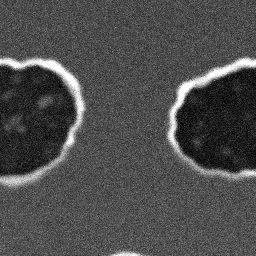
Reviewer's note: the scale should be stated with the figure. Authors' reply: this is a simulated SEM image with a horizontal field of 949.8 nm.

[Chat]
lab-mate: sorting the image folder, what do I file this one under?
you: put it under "holes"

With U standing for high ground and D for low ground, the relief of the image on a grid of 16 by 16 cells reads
UUUUUUUUUUUUUUUU
UUUUUUUUUUUUUUUU
UUUUUUUUUUUUUUUU
UUUUUUUUUUUUUUUU
DDDDUUUUUUUUUUUD
DDDDDUUUUUUUDDDD
DDDDDUUUUUUDDDDD
DDDDDUUUUUUDDDDD
DDDDUUUUUUUDDDDD
DDDDUUUUUUUDDDDD
DDDUUUUUUUUUUDDD
UUUUUUUUUUUUUUUU
UUUUUUUUUUUUUUUU
UUUUUUUUUUUUUUUU
UUUUUUUUUUUUUUUU
UUUUUUUUUUUUUUUU